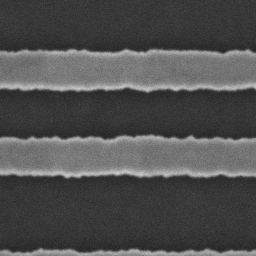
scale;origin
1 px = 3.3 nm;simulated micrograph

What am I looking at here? lines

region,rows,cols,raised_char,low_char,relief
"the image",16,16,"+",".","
................
................
................
++++++++++++++++
++++++++++++++++
.++++++++++++++.
................
................
................
++++++++++++++++
++++++++++++++++
................
................
................
................
................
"